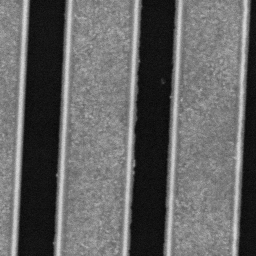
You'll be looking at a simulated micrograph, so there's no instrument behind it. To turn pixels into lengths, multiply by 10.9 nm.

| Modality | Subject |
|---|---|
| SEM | one or a few lines or trenches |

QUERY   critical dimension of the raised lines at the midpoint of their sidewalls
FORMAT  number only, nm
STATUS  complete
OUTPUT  726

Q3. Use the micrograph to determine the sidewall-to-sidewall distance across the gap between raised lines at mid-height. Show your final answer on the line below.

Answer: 472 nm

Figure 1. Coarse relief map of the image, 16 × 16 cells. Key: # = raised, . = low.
##..#####..####.
##..####...####.
##..####...####.
#...####...####.
#...####...####.
#...####...####.
#...####...####.
#...####...####.
#...####...####.
#...####...####.
#...####...####.
#...####...####.
#...####...####.
#...####...####.
#...####...####.
#...####...####.